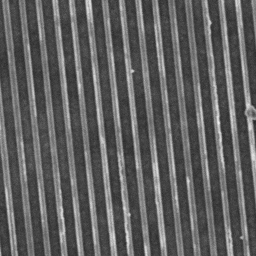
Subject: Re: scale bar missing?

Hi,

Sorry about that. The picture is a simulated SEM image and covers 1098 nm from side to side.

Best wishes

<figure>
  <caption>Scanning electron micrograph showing parallel lines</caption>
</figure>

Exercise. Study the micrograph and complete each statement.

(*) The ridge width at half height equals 21.3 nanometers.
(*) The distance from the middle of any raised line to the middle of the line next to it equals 70.7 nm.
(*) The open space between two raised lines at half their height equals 46.3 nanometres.